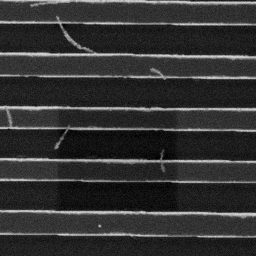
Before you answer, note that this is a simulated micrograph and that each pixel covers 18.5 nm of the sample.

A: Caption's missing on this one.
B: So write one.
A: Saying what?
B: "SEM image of lines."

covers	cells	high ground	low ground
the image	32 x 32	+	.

++++++++++++++++++++++++++++++++
++++++++++++++++++++++++++++++++
++++++++++++++++++++++++++++++++
................................
................................
................................
................................
++++++++++++++++++++++++++++++++
++++++++++++++++++++++++++++++++
.....+++++++++++++++++++++++++++
................................
................................
................................
++++++++++++.++.................
++++++++++++++++++++++++++++++++
++++++++++++++++++++++++++++++++
................................
................................
................................
................................
++++++++++++++++++++++++++++++++
++++++++++++++++++++++++++++++++
++++++++++++++++++++++++++++++++
................................
................................
................................
+++++++++++++...................
++++++++++++++++++++++++++++++++
++++++++++++++++++++++++++++++++
........................++++++++
................................
................................